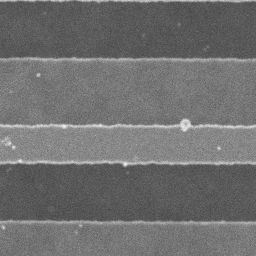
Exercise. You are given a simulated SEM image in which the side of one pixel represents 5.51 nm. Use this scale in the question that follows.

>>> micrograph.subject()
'lines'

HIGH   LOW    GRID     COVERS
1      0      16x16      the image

0000000000000000
0000000000000000
0000000000000000
0000000000000000
1111111111111111
1111111111111111
1111111111111111
1111111111111111
1111111111111111
1111111111111111
0000000000000000
0000000000000000
0000000000000000
0000000000000000
1111111111111111
1111111111111111